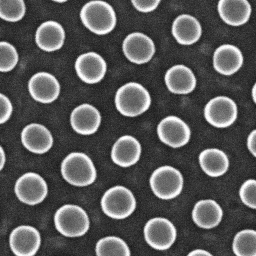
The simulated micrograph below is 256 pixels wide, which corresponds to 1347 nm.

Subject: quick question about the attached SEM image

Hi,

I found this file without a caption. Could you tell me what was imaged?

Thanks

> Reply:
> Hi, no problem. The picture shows a regular array of raised bodies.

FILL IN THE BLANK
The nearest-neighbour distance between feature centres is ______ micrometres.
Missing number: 0.267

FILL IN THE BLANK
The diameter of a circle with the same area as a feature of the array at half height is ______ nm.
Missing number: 152